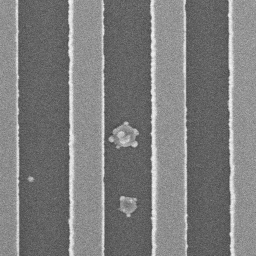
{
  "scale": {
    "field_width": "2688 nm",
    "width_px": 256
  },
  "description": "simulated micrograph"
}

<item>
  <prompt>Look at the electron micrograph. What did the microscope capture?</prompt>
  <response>lines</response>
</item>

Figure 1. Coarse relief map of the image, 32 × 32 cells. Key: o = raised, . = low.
oo.......oooo......oooo......ooo
oo.......oooo......oooo......ooo
oo.......oooo......oooo......ooo
oo.......oooo......oooo......ooo
oo.......oooo......oooo......ooo
oo.......oooo......oooo......ooo
oo.......oooo......oooo......ooo
oo.......oooo......oooo......ooo
oo.......oooo......oooo......ooo
oo.......oooo......oooo......ooo
oo.......oooo......oooo......ooo
oo.......oooo......oooo......ooo
oo.......oooo......oooo......ooo
oo.......oooo......oooo......ooo
oo.......oooo......oooo......ooo
oo.......oooo......oooo......ooo
oo.......oooo......oooo......ooo
oo.......oooo......oooo......ooo
oo.......oooo......oooo......ooo
oo.......oooo......oooo......ooo
oo.......oooo......oooo......ooo
oo.......oooo......oooo......ooo
oo.......oooo......oooo......ooo
oo.......oooo......oooo......ooo
oo.......oooo......oooo......ooo
oo.......oooo......oooo......ooo
oo.......oooo......oooo......ooo
oo.......oooo......oooo......ooo
oo.......oooo......oooo......ooo
oo.......oooo......oooo......ooo
oo.......oooo......oooo......ooo
oo.......oooo......oooo......ooo